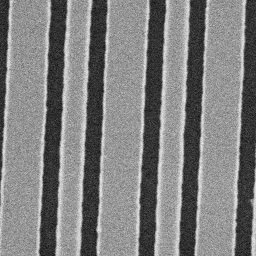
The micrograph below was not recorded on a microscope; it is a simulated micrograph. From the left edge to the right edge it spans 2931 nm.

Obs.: lines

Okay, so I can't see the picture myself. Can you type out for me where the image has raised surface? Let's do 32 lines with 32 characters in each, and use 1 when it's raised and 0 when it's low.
01111100111000111110011100111110
01111100111000111110011100111110
01111100111001111110011100111100
01111100111001111100011000111100
01111100111001111100011000111100
01111100111001111100011000111100
01111100111001111100111000111100
01111100111001111100111000111100
01111100111001111100111000111100
01111100111001111100111001111100
01111100111001111100111001111100
01111100111001111100111001111100
01111100111001111100111001111100
01111100111001111100111001111100
01111100111001111100111001111100
01111100111001111100111001111100
01111100111001111100111001111100
01111000110001111100111001111100
11111000110001111100111001111100
11111000110001111100111001111100
11111000110001111100111001111100
11111000110001111100111001111100
11111001110001111100111001111100
11111001110001111000111001111100
11111001110001111000111001111100
11111001110011111000111001111100
11111001110011111000111001111000
11111001110011111000110001111000
11111001110011111000110001111000
11111001110011111000110001111000
11111001110011111001110001111000
11111001110011111001110011111001